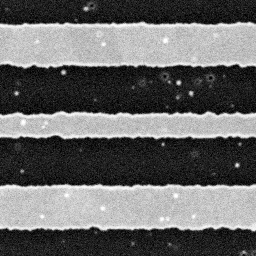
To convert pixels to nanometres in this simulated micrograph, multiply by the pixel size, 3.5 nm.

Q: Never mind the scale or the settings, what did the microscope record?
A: lines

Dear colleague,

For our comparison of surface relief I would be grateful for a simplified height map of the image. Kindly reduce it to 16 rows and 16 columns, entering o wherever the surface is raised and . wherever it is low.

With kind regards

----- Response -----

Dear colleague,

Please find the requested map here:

................
........o......o
oooooooooooooooo
oooooooooooooooo
................
................
................
oooooooooooooooo
ooo.oooooooooooo
................
................
................
oooooooooooooooo
oooooooooooooooo
................
................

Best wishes